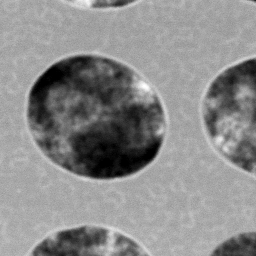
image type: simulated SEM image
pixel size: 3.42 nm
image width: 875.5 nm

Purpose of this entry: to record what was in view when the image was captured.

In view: holes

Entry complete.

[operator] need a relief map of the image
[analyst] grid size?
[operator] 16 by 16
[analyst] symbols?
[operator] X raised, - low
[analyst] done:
XXXXXXXXXXXXXXXX
XXXXXXXXXXXXXXXX
XXXXXXXXXXXXXXXX
XXXXX-XXXXXXXXXX
XXX-----XXXXXX--
XX-------XXXX---
XX--------XXX---
XX--------XXX---
XX--------XXX---
XXX-------XXXX--
XXXX-----XXXXXX-
XXXXXXXXXXXXXXXX
XXXXXXXXXXXXXXXX
XXXXXXXXXXXXXXXX
XXXX---XXXXXXXXX
XX-------XXXXX--